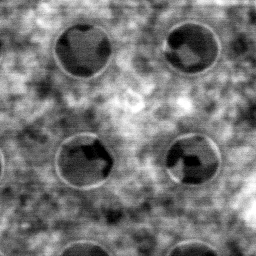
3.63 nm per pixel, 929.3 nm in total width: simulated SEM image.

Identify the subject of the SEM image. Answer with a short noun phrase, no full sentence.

raised bodies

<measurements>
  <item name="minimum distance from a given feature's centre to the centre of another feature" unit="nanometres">391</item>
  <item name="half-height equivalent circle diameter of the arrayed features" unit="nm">204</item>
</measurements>